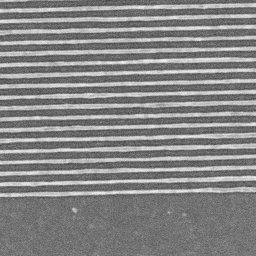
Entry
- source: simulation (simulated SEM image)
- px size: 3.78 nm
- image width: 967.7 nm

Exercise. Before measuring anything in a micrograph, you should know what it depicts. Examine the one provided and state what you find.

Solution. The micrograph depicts parallel lines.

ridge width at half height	9	nm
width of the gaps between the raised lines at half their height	30.2	nm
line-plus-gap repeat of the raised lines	41	nm